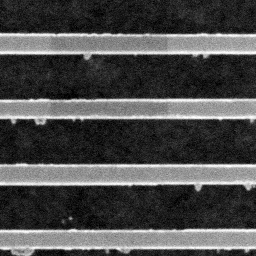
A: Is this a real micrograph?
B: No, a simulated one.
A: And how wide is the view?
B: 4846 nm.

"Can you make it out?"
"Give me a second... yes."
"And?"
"lines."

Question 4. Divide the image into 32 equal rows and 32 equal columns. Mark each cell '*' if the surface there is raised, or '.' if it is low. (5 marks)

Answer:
................................
................................
................................
................................
********************************
********************************
********************************
................................
................................
................................
................................
................................
............*.******************
********************************
********************************
................................
................................
................................
................................
................................
................................
********************************
********************************
................................
................................
................................
................................
................................
................................
********************************
********************************
..**............................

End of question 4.